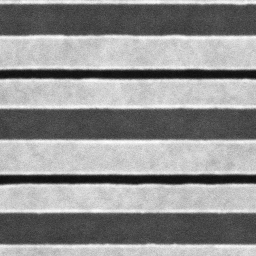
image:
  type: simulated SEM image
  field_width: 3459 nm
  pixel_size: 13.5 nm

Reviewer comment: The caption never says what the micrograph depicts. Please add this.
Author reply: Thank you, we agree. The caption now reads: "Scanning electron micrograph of lines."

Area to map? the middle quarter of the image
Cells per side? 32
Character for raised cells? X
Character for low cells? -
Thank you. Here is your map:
XXXXXXXXXXXXXXXXXXXXXXXXXXXXXXXX
--------------------------------
--------------------------------
--------------------------------
XXXXXXXXXXXXXXXXXXXXXXXXXXXXXXXX
XXXXXXXXXXXXXXXXXXXXXXXXXXXXXXXX
XXXXXXXXXXXXXXXXXXXXXXXXXXXXXXXX
XXXXXXXXXXXXXXXXXXXXXXXXXXXXXXXX
XXXXXXXXXXXXXXXXXXXXXXXXXXXXXXXX
XXXXXXXXXXXXXXXXXXXXXXXXXXXXXXXX
XXXXXXXXXXXXXXXXXXXXXXXXXXXXXXXX
--------------------------------
--------------------------------
--------------------------------
--------------------------------
--------------------------------
--------------------------------
--------------------------------
--------------------------------
XXXXXXXXXXXXXXXXXXXXXXXXXXXXXXXX
XXXXXXXXXXXXXXXXXXXXXXXXXXXXXXXX
XXXXXXXXXXXXXXXXXXXXXXXXXXXXXXXX
XXXXXXXXXXXXXXXXXXXXXXXXXXXXXXXX
XXXXXXXXXXXXXXXXXXXXXXXXXXXXXXXX
XXXXXXXXXXXXXXXXXXXXXXXXXXXXXXXX
XXXXXXXXXXXXXXXXXXXXXXXXXXXXXXXX
XXXXXXXXXXXXXXXXXXXXXXXXXXXXXXXX
XXXXXXXXXXXXXXXXXXXXXXXXXXXXXXXX
--------------------------------
--------------------------------
XXXXXXXXXXXXXXXXXXXXXXXXXXXXXXXX
XXXXXXXXXXXXXXXXXXXXXXXXXXXXXXXX